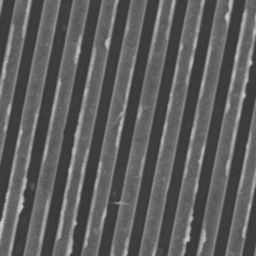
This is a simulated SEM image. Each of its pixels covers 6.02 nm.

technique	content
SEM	parallel lines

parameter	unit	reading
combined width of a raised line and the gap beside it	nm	170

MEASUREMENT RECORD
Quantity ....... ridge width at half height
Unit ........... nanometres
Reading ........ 95.3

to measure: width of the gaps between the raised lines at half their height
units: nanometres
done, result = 77.6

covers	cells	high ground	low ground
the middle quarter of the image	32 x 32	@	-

@@@---@@@@----@@@----@@@@---@@@@
@@@---@@@@----@@@----@@@@---@@@@
@@@---@@@@---@@@@---@@@@----@@@-
@@----@@@@---@@@@---@@@@----@@@-
@@----@@@----@@@@---@@@@---@@@@-
@@---@@@@----@@@----@@@@---@@@@-
@@---@@@@----@@@----@@@@---@@@@-
@@---@@@@---@@@@---@@@@----@@@--
@@---@@@@---@@@@---@@@@---@@@@--
@----@@@@---@@@@---@@@@---@@@@--
@---@@@@----@@@----@@@@---@@@@--
@---@@@@----@@@----@@@@---@@@@--
@---@@@@---@@@@---@@@@----@@@---
@---@@@@---@@@@---@@@@----@@@---
----@@@----@@@@---@@@@---@@@@---
---@@@@----@@@----@@@@---@@@@---
---@@@@----@@@----@@@@---@@@@---
---@@@@---@@@@---@@@@----@@@----
---@@@@---@@@@---@@@@---@@@@----
--@@@@@---@@@@---@@@@---@@@@---@
--@@@@----@@@@---@@@@---@@@@---@
--@@@@----@@@----@@@@---@@@@---@
--@@@@---@@@@----@@@----@@@@---@
--@@@@---@@@@---@@@@----@@@----@
--@@@@---@@@@---@@@@---@@@@---@@
-@@@@----@@@@---@@@@---@@@@---@@
-@@@@---@@@@----@@@@---@@@@---@@
-@@@@---@@@@----@@@----@@@@---@@
-@@@@---@@@@---@@@@----@@@----@@
-@@@@---@@@@---@@@@---@@@@----@@
-@@@@---@@@@---@@@@---@@@@----@@
@@@@----@@@----@@@@---@@@@---@@@